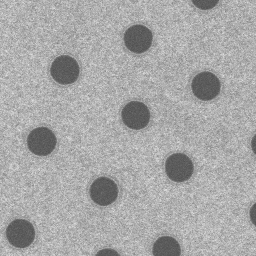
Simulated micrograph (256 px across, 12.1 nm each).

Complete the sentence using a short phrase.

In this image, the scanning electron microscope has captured a regular array of holes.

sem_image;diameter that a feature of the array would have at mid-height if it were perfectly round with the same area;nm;354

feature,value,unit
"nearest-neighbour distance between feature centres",916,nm